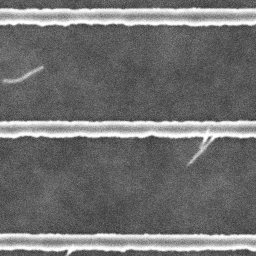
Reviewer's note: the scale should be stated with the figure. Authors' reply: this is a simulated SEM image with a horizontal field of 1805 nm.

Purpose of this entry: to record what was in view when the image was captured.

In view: lines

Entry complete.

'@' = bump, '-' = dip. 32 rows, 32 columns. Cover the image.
--------------------------------
@@@@@@@@@@@@@@@@@@@@@@@@@@@@@@@@
@@@@@@@@@@@@@@@@@@@@@@@@@@@@@@@@
--------------------------------
--------------------------------
--------------------------------
--------------------------------
--------------------------------
--------------------------------
--------------------------------
--------------------------------
--------------------------------
--------------------------------
--------------------------------
--------------------------------
@@@@@@@@@@@@@@@@@@@@@@@@@@@@@@@@
@@@@@@@@@@@@@@@@@@@@@@@@@@@@@@@@
--------------------------------
--------------------------------
--------------------------------
--------------------------------
--------------------------------
--------------------------------
--------------------------------
--------------------------------
--------------------------------
--------------------------------
--------------------------------
--------------------------------
@@@@@@@@@@@@@@@@@@@@@@@@@@@@-@@@
@@@@@@@@@@@@@@@@@@@@@@@@@@@@@@@@
--------------------------------